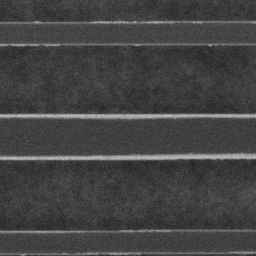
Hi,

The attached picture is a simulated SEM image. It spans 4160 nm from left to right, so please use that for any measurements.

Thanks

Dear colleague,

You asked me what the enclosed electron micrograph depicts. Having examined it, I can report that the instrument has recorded lines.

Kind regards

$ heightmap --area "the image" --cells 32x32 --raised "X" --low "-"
--------------------------------
--------------------------------
--------------------------------
XXXXXXXXXXXXXXXXXXXXXXXXXXXXXXXX
XXXXXXXXXXXXXXXXXXXXXXXXXXXXXXXX
XXXXXXXXXXXXXXXXXXXXXXXXXXXXXXXX
--------------------------------
--------------------------------
--------------------------------
--------------------------------
--------------------------------
--------------------------------
--------------------------------
--------------------------------
XXXXXXXXXXXXXXXXXXXXXXXXXXXXXXXX
XXXXXXXXXXXXXXXXXXXXXXXXXXXXXXXX
XXXXXXXXXXXXXXXXXXXXXXXXXXXXXXXX
XXXXXXXXXXXXXXXXXXXXXXXXXXXXXXXX
XXXXXXXXXXXXXXXXXXXXXXXXXXXXXXXX
XXXXXXXXXXXXXXXXXXXXXXXXXXXXXXXX
--------------------------------
--------------------------------
--------------------------------
--------------------------------
--------------------------------
--------------------------------
--------------------------------
--------------------------------
--------------------------------
XXXXXXXXXXXXXXXXXXXXXXXXXXXXXXXX
XXXXXXXXXXXXXXXXXXXXXXXXXXXXXXXX
XXXXXXXXXXXXXXXXXXXXXXXXXXXXXXXX